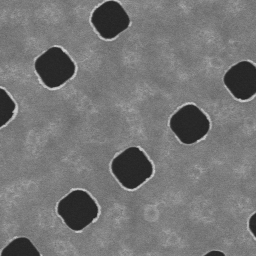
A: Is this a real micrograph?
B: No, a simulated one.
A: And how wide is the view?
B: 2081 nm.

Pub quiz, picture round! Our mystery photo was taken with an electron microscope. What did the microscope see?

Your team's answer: holes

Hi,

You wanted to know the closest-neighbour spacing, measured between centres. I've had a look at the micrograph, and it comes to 70.4 px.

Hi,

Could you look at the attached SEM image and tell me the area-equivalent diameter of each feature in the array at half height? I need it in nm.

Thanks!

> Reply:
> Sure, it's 306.